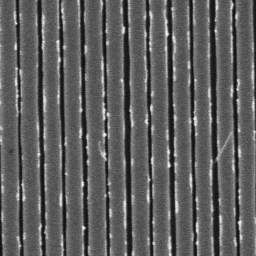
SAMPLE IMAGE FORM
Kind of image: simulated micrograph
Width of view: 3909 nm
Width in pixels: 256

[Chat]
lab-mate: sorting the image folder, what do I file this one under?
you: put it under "parallel lines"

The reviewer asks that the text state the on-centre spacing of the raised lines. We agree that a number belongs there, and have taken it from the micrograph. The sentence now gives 330 nm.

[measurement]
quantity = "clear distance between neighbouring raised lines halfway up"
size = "0.0668 µm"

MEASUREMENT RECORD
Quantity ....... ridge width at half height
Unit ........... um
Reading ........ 0.254